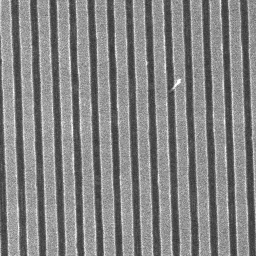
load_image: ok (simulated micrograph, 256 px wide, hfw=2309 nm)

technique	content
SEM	parallel lines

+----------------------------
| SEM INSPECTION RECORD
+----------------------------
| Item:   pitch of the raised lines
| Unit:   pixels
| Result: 19.1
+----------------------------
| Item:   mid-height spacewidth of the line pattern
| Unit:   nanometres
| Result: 58.6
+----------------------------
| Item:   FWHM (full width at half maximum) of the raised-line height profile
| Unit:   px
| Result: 12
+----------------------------